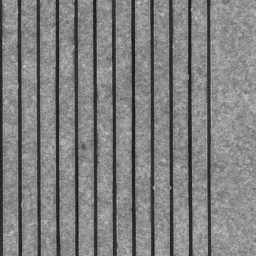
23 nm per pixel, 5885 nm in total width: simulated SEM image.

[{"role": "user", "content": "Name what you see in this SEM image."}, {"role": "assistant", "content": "parallel lines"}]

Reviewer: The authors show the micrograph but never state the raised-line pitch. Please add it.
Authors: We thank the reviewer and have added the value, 434 nm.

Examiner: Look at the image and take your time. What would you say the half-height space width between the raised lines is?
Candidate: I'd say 101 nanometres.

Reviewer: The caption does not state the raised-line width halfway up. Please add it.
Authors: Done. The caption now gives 342 nm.